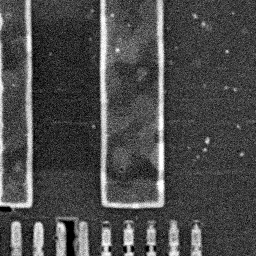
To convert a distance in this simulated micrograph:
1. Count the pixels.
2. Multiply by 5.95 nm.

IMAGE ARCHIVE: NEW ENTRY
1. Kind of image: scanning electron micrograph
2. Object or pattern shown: wiring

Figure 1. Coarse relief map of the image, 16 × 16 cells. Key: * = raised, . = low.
**....****......
**....****......
**....****......
**....****......
**....****......
**....****......
**....****......
**....****......
**....****......
**....****......
**....****......
**....****......
**.....***......
................
................
................